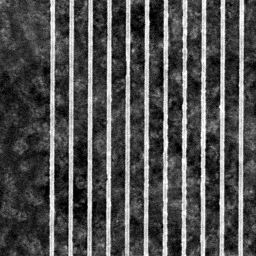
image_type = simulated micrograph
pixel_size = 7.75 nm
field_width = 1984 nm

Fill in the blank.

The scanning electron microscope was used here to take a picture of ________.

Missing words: parallel lines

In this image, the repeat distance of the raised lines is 146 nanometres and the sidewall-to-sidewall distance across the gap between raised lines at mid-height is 125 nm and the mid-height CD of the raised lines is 2.75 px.